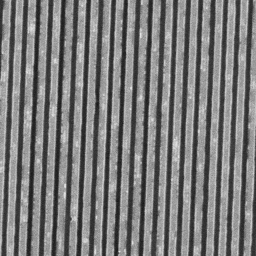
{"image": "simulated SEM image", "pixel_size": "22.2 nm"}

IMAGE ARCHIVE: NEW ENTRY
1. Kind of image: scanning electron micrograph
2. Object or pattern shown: parallel lines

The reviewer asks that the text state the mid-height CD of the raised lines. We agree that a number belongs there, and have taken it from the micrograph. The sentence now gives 144 nm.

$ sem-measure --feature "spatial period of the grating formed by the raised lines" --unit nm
277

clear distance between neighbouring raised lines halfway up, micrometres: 0.125